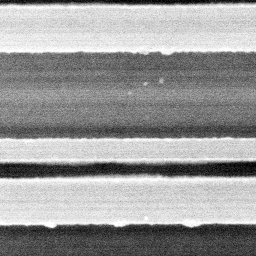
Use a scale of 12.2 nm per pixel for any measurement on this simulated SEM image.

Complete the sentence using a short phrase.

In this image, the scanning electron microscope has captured lines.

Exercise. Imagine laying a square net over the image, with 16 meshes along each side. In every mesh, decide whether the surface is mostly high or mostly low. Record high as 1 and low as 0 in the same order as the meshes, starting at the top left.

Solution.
1111111111111111
1111111111111111
1111111111111111
0000000000000000
0000000000000000
0000000000000000
0000000000000000
0000000000000000
0000000000000000
1111111111111111
1111111111111111
1111111111111111
1111111111111111
1111111111111111
0000000000000000
0000000000000000